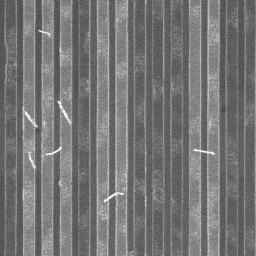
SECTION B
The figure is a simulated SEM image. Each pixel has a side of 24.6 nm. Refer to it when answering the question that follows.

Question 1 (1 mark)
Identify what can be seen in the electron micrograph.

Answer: parallel lines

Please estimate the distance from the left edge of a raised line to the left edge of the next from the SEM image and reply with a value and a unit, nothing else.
454 nm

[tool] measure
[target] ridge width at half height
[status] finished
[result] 271 nm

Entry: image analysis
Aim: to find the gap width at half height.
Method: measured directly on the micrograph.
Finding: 0.175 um